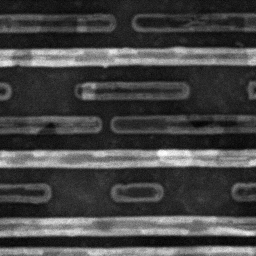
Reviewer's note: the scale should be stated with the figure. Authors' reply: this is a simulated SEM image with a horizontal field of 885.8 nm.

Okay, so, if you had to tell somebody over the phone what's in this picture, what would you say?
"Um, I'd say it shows parallel lines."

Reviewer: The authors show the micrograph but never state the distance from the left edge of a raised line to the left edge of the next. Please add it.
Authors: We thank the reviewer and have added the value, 0.117 um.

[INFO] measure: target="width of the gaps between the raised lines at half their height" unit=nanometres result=65.7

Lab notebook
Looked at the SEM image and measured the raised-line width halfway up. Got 0.0532 microns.